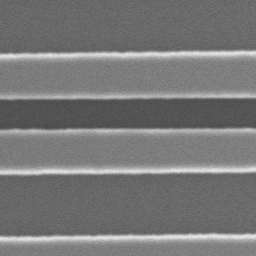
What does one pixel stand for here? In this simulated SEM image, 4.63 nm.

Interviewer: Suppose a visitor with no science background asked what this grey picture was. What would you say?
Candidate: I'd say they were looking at lines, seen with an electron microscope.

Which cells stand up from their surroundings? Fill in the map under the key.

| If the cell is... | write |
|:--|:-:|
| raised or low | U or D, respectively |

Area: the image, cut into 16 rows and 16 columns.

DDDDDDDDDDDDDDDD
DDDDDDDDDDDDDDDD
DDDDDDDDDDDDDDDD
DUUUUUUUUUUUUUUU
UUUUUUUUUUUUUUUU
UUUUUUUUUUUUUUUU
DDDDDDDDDDDDDDDD
DDDDDDDDDDDDDDDD
UUUUUUUUUUUUUUUU
UUUUUUUUUUUUUUUU
UUUUUUUUUUUUUUUU
DDDDDDDDDDDDDDDD
DDDDDDDDDDDDDDDD
DDDDDDDDDDDDDDDD
DDDDDDDDDDDDDDDD
UUUUUUUUUUUUUUUU